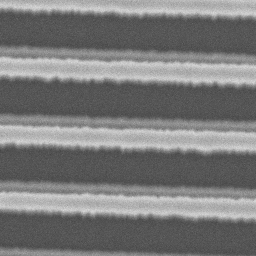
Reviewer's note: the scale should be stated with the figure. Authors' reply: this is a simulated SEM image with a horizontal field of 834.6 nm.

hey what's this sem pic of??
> lines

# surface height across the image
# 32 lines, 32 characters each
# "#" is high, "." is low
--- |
################################
..........#.#.##################
................................
................................
................................
................................
#########.......................
################################
################################
.#.#############################
...............................#
................................
................................
................................
................................
#############################.##
################################
################################
...............#################
................................
................................
................................
................................
##############..................
################################
################################
........########################
................................
................................
................................
................................
###.............................